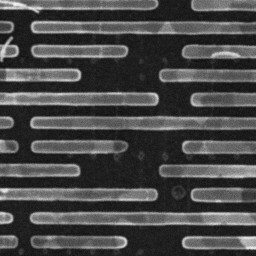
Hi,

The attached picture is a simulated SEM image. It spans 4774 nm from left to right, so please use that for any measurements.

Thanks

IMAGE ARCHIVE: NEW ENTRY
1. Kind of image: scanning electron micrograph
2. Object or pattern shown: wiring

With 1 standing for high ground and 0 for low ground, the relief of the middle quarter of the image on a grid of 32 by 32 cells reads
00000000000000000000000000000000
00000000000000000000000000000000
11110000000000000000000011111111
11110000000000000000000011111111
00000000000000000000000000000000
00000000000000000000000000000000
00000000000000000000000000000000
01111111111111111111111000000000
11111111111111111111111000000000
11111111111111111111111000000000
00000000000000000000000000000000
00000000000000000000000000000000
00000000000000000000000000000000
00111111111000000000001111000000
11111111111111111111111111111111
11111111111111111111111111111111
00000000000000000000000000000000
00000000000000000000000000000000
00000000000000000000000000000000
11111111111111100000000000000011
11111111111111110000000000000011
11111111111111100000000000000011
00000000000000000000000000000000
00000000000000000000000000000000
00000000000000000000000000000000
11100000000000000000000000111111
11110000000000000000000011111111
11110000000000000000000011111111
00000000000000000000000000000000
00000000000000000000000000000000
00000000000000000000000000000000
11111111111111111111111000000000